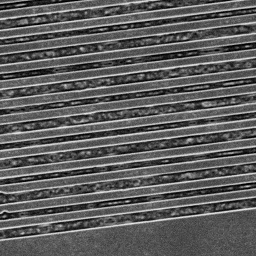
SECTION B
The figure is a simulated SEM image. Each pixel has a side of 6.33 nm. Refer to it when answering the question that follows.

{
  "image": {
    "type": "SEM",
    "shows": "parallel lines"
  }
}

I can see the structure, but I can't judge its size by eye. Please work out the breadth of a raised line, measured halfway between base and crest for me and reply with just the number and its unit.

51.8 nanometers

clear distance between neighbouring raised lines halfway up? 62.8 nm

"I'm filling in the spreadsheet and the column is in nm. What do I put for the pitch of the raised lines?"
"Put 109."